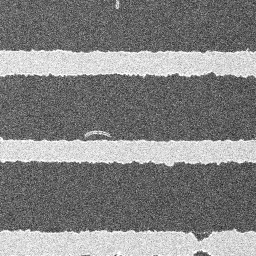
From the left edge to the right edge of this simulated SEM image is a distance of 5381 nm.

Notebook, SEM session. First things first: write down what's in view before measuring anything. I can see one or a few lines or trenches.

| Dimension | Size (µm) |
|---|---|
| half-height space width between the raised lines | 1.45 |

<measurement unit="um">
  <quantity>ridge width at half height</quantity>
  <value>0.455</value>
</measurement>